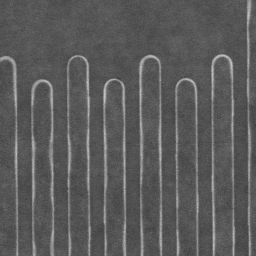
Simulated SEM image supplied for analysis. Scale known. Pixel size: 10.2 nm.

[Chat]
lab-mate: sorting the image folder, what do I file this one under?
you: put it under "groups of lines, slits or small figures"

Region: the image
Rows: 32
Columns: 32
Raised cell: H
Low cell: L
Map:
LLLLLLLLLLLLLLLLLLLLLLLLLLLLLLLH
LLLLLLLLLLLLLLLLLLLLLLLLLLLLLLLH
LLLLLLLLLLLLLLLLLLLLLLLLLLLLLLLH
LLLLLLLLLLLLLLLLLLLLLLLLLLLLLLLH
LLLLLLLLLLLLLLLLLLLLLLLLLLLLLLLH
LLLLLLLLLLLLLLLLLLLLLLLLLLLLLLLH
LLLLLLLLLLLLLLLLLLLLLLLLLLLLLLLH
HLLLLLLLLHHLLLLLLLHHLLLLLLLHHLLH
HHLLLLLLHHHLLLLLLLHHLLLLLLLHHLLH
HHLLLLLLHHHLLLLLLLHHLLLLLLLHHLLH
HHLLLHLLHHHLLHHLLLHHLLHHLLLHHLLH
HHLLHHLLHHHLLHHLLLHHLLHHHLLHHLLH
HHLLHHHLHHHLLHHLLLHHLLHHHLHHHLLH
HHLLHHHLLHHLLHHLLLHHLLHHHLLHHLLH
HHLLHHHLLHHLLHHHLLHHLLHHHLLHHLLH
HHLLHHHLLHHLLHHHLLHHLLHHHLLHHLLH
HHLLHHHLLHHLLHHHLLHHLLHHHLLHHLLH
HHLLHHHLLHHLLHHLLLHHLLHHHLLHHLLH
HHLLHHLLLHHLLHHLLLHHLLHHHLLHHLLH
HHLLHHLLLHHLLHHHLLHHLLHHHLLHHLLH
HHLLHHHLLHHLLHHHLLHHLLHHHLLHHLLH
HHLLHHHLLHHLLHHHLLHHLLHHHLLHHLLH
HHLLHHHLLHHLLHHHLLHHLLHHHLLHHLLH
HHLLHHHLLHHLLHHHLLHHLLHHHLLHHLLH
HHLLHHHLLHHLLHHHLLHHLLHHHLLHHLLH
HHLLHHHLLHHLLHHHLLHHLLHHHLLHHLLH
HHLLHHHLLHHLLHHHLLHHLLHHHLLHHLLH
HHLLHHHLLHHLLHHHLLHHLLHHHLLHHLLH
HHLLHHHLLHHLLHHHLLHHLLHHHLLHHLLH
HHLLHHHLLHHLLHHHLLHHLLHHHLLHHLLH
HHLLHHHLLHHLLHHHLLHHLLHHHLLHHLLH
HHLLHHHLLHHLLHHHLLHHLLHHHLLHHLLH